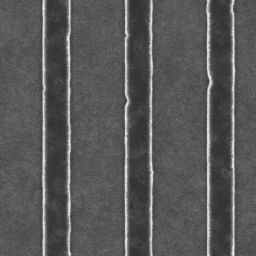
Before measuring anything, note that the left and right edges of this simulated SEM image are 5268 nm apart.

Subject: one or a few lines or trenches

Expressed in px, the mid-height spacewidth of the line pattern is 56.6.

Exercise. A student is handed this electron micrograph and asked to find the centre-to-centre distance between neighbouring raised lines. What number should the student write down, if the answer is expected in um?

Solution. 1.69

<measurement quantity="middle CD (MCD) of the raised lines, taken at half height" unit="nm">530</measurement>